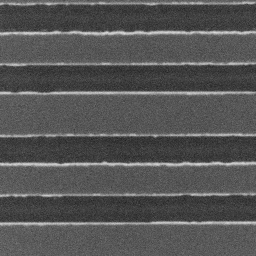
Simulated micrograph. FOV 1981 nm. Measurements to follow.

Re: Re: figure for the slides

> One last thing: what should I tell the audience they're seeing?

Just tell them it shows lines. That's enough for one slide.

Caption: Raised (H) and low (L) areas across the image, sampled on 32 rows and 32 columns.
HHHHHHHLHLLHLLLLLLHHLLLLLLLLLLLL
LLLLLLLLLLLLLLLLLLLLLLLLLLLLLLLL
LLLLLLLLLLLLLLLLLLLLLLLLLLLLLLLL
LLLLLLLLLLLLLLLLLLLLLLLLLLLLLLLL
HHHHHHHHHHHHHHHHHHHHHHHHHHHHHHHH
HHHHHHHHHHHHHHHHHHHHHHHHHHHHHHHH
HHHHHHHHHHHHHHHHHHHHHHHHHHHHHHHH
HHHHHHHHHHHHHHHHHHHHHHHHHHHHHHHH
LLLLLLLLLLLLLLLLLLLLLLLLLLLLLLLL
LLLLLLLLLLLLLLLLLLLLLLLLLLLLLLLL
LLLLLLLLLLLLLLLLLLLLLLLLLLLLLLLL
LLLLLLLLLLLLLLLLLLLLLLLLLLLLLLLL
HHHHHHHHHHHHHHHHHHHHHHHHHHHHHHHH
HHHHHHHHHHHHHHHHHHHHHHHHHHHHHHHH
HHHHHHHHHHHHHHHHHHHHHHHHHHHHHHHH
HHHHHHHHHHHHHHHHHHHHHHHHHHHHHHHH
HHHHHHHHHHHHHHHHHHHHHHHHHHHHHHHH
LLLLLLLLLLLLLLLLLLLLLLLLLLLLLLLL
LLLLLLLLLLLLLLLLLLLLLLLLLLLLLLLL
LLLLLLLLLLLLLLLLLLLLLLLLLLLLLLLL
LHLHLLLLHHLHHHHHLLLHHLHHHHHHHHHH
HHHHHHHHHHHHHHHHHHHHHHHHHHHHHHHH
HHHHHHHHHHHHHHHHHHHHHHHHHHHHHHHH
HHHHHHHHHHHHHHHHHHHHHHHHHHHHHHHH
LLLLLLLLLLLLLLLLLLLLLLLLLLLLLLLL
LLLLLLLLLLLLLLLLLLLLLLLLLLLLLLLL
LLLLLLLLLLLLLLLLLLLLLLLLLLLLLLLL
LLLLLLLLLLLLLLLLLLLLLLLLLLLLLLLL
HHHHHHHHHHHHHHHHHHHHHHHHHHHHHHHH
HHHHHHHHHHHHHHHHHHHHHHHHHHHHHHHH
HHHHHHHHHHHHHHHHHHHHHHHHHHHHHHHH
HHHHHHHHHHHHHHHHHHHHHHHHHHHHHHHH